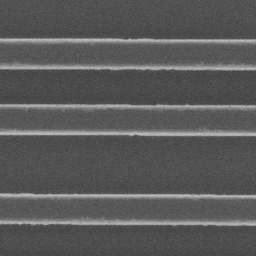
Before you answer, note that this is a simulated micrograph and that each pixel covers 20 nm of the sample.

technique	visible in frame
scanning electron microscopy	lines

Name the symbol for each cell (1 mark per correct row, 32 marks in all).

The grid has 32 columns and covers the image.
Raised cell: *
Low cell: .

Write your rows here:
................................
................................
................................
................................
................................
********************************
********************************
********************************
........*..*********************
................................
................................
................................
................................
********************************
********************************
********************************
********************************
................................
................................
................................
................................
................................
................................
................................
********************************
********************************
********************************
********************************
................................
................................
................................
................................